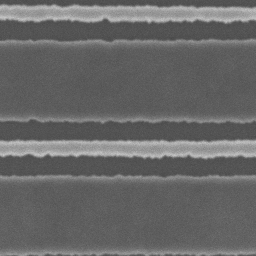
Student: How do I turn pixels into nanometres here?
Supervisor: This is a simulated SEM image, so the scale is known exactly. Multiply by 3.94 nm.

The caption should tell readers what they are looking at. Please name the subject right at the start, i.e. lines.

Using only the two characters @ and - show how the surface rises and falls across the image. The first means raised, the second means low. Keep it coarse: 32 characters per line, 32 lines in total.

--------------------------------
@@@@@@@@@@@@@@@@@@@@@@@@@@@@@@@@
--@@@@@@@@@@@@@@@@@@@@@@@@@@@@@-
--------------------------------
--------------------------------
@@@@@@@@@@@@@@@@@@@@@@@@@@@@@@@@
@@@@@@@@@@@@@@@@@@@@@@@@@@@@@@@@
@@@@@@@@@@@@@@@@@@@@@@@@@@@@@@@@
@@@@@@@@@@@@@@@@@@@@@@@@@@@@@@@@
@@@@@@@@@@@@@@@@@@@@@@@@@@@@@@@@
@@@@@@@@@@@@@@@@@@@@@@@@@@@@@@@@
@@@@@@@@@@@@@@@@@@@@@@@@@@@@@@@@
@@@@@@@@@@@@@@@@@@@@@@@@@@@@@@@@
@@@@@@@@@@@@@@@@@@@@@@@@@@@@@@@@
@@@@@@@@@@@@@@@@@@@@@@@@@@@@@@@@
--------------------------------
--------------------------------
-----------------------------@@@
@@@@@@@@@@@@@@@@@@@@@@@@@@@@@@@@
---------------@@@@@@@@-@@@@@-@@
--------------------------------
--------------------------------
@@@@@@@@@@@@@@@@@@@@@@@@@@@@@@@@
@@@@@@@@@@@@@@@@@@@@@@@@@@@@@@@@
@@@@@@@@@@@@@@@@@@@@@@@@@@@@@@@@
@@@@@@@@@@@@@@@@@@@@@@@@@@@@@@@@
@@@@@@@@@@@@@@@@@@@@@@@@@@@@@@@@
@@@@@@@@@@@@@@@@@@@@@@@@@@@@@@@@
@@@@@@@@@@@@@@@@@@@@@@@@@@@@@@@@
@@@@@@@@@@@@@@@@@@@@@@@@@@@@@@@@
@@@@@@@@@@@@@@@@@@@@@@@@@@@@@@@@
@@@@@@@@@@@@@@@@@@@@@@@@@@@@@@@@